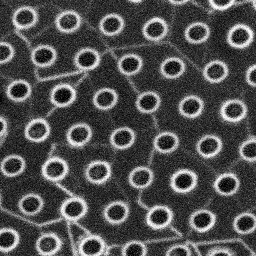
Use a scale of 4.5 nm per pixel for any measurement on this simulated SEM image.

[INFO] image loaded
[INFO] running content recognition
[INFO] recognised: a regular array of holes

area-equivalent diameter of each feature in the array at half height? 83.9 nanometres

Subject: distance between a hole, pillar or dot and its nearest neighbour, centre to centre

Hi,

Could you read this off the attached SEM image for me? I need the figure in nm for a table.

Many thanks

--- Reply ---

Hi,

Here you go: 191